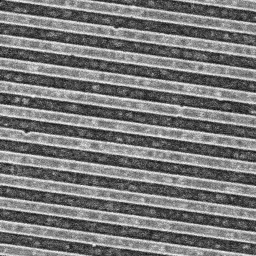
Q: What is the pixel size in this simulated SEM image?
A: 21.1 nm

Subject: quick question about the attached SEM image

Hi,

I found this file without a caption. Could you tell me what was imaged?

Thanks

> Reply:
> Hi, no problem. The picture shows parallel lines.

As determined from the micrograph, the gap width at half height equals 282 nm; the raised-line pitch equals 486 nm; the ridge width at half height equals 201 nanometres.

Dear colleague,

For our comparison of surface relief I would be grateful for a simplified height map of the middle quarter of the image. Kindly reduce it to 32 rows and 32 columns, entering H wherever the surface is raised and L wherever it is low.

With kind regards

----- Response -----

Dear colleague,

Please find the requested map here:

LLLLLLLLLLLLLLLLLLLLLLHHHHHHHHHH
HHHHHHLLLLLLLLLLLLLLLLLLLLLLLHHH
HHHHHHHHHHHHHLLLLLLLLLLLLLLLLLLL
LLHHHHHHHHHHHHHHHHHLLLLLLLLLLLLL
LLLLLLLLLHHHHHHHHHHHHHHHHHLLLLLL
LLLLLLLLLLLLLLLLLHHHHHHHHHHHHHHH
LLLLLLLLLLLLLLLLLLLLLLLLHHHHHHHH
HHHHHHHLLLLLLLLLLLLLLLLLLLLLLLLH
HHHHHHHHHHHHHLLLLLLLLLLLLLLLLLLL
LLLLHHHHHHHHHHHHHHHHHLLLLLLLLLLL
LLLLLLLLLLLHHHHHHHHHHHHHHHHHLLLL
LLLLLLLLLLLLLLLLLLHHHHHHHHHHHHHH
LLLLLLLLLLLLLLLLLLLLLLLLLHHHHHHH
HHHHHHHLLLLLLLLLLLLLLLLLLLLLLLLL
HHHHHHHHHHHHHHLLLLLLLLLLLLLLLLLL
LLLLLHHHHHHHHHHHHHHHHHLLLLLLLLLL
LLLLLLLLLLLLHHHHHHHHHHHHHHHHHLLL
LLLLLLLLLLLLLLLLLLLLHHHHHHHHHHHH
HLLLLLLLLLLLLLLLLLLLLLLLLLLHHHHH
HHHHHHHHHLLLLLLLLLLLLLLLLLLLLLLL
HHHHHHHHHHHHHHHHLLLLLLLLLLLLLLLL
LLLLLHLHHHHHHHHHHHHHHHHLLLLLLLLL
LLLLLLLLLLLLLLHHHHHHHHHHHHHHHHLL
LLLLLLLLLLLLLLLLLLLLLHHHHHHHHHHH
HHHLLLLLLLLLLLLLLLLLLLLLLLLLHHHH
HHHHHHHHHHLLLLLLLLLLLLLLLLLLLLLL
LHHHHHHHHHHHHHHHHLLLLLLLLLLLLLLL
LLLLLLLLHHHHHHHHHHHHHHHHHLLLLLLL
LLLLLLLLLLLLLLHHHHHHHHHHHHHHHHHH
LLLLLLLLLLLLLLLLLLLLLLLHHHHHHHHH
HHHHHLLLLLLLLLLLLLLLLLLLLLLLHHHH
HHHHHHHHHHHHLLLLLLLLLLLLLLLLLLLL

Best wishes